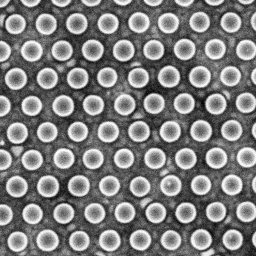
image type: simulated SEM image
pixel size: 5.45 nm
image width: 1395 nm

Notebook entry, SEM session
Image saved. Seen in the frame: a regular array of raised bodies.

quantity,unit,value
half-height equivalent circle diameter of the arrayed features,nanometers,106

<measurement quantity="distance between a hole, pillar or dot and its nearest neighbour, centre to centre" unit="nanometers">166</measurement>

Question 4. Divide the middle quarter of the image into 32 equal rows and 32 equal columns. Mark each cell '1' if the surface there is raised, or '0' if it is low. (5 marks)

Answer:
00000000000000000000000000000000
00111000001100000111000001110000
01111100011110001111100011111000
01111100011110001111100011111000
01111100011110001111100011110000
00111000001100000111000000100000
00000000000000000000000000000000
00000000000000000000000000000000
10000011100000111000011110001111
11000111110001111100111110001111
11000111110001111100111110001111
11000111100001111000011100001111
10000001000000010000000000000000
00000000000000000000000000000000
00000000000000000000000000000000
00111000011110000111100001111000
01111100011111001111100011111000
01111100011110001111100011111000
00111000011110000111100001110000
00000000000000000000000000000000
00000000000000000000000000000000
00000011000000110000001100000111
11000111100001111000011110001111
11000111110001111000111110001111
11000111110001111000111110001111
10000011100000110000011100000111
00000000000000000000000000000000
00000000000000000000000000000000
00111000001110000011000001110000
01111100011110000111100001111000
01111100011111000111100011111000
01111100011110000111100001111000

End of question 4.